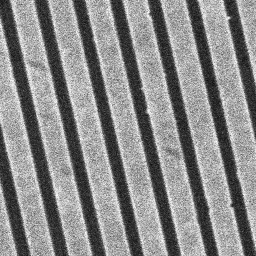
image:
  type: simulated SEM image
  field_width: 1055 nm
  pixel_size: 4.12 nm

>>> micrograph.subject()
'parallel lines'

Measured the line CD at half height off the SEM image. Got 25.9 px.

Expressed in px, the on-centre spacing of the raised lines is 36.8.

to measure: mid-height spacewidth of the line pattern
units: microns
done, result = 0.0442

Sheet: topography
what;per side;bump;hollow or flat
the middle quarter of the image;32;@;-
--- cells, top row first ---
@@@@@@---@@@@@@---@@@@@@@---@@@@
@@@@@@---@@@@@@@--@@@@@@@---@@@@
@@@@@@---@@@@@@@---@@@@@@---@@@@
@@@@@@@--@@@@@@@---@@@@@@---@@@@
@@@@@@@---@@@@@@---@@@@@@@---@@@
-@@@@@@---@@@@@@@--@@@@@@@---@@@
-@@@@@@---@@@@@@@--@@@@@@@---@@@
-@@@@@@@--@@@@@@@---@@@@@@---@@@
-@@@@@@@---@@@@@@---@@@@@@@--@@@
-@@@@@@@---@@@@@@---@@@@@@@---@@
--@@@@@@---@@@@@@@--@@@@@@@---@@
--@@@@@@---@@@@@@@--@@@@@@@---@@
--@@@@@@@---@@@@@@---@@@@@@@--@@
--@@@@@@@---@@@@@@---@@@@@@@---@
---@@@@@@---@@@@@@@--@@@@@@@---@
---@@@@@@---@@@@@@@---@@@@@@---@
---@@@@@@@--@@@@@@@---@@@@@@---@
---@@@@@@@---@@@@@@---@@@@@@@--@
@--@@@@@@@---@@@@@@---@@@@@@@---
@---@@@@@@---@@@@@@@---@@@@@@---
@---@@@@@@@--@@@@@@@---@@@@@@---
@---@@@@@@@---@@@@@@---@@@@@@@--
@@--@@@@@@@---@@@@@@---@@@@@@@--
@@---@@@@@@---@@@@@@@--@@@@@@@--
@@---@@@@@@---@@@@@@@---@@@@@@--
@@---@@@@@@@---@@@@@@---@@@@@@@-
@@---@@@@@@@---@@@@@@---@@@@@@@-
@@@---@@@@@@---@@@@@@@--@@@@@@@-
@@@---@@@@@@---@@@@@@@---@@@@@@-
@@@---@@@@@@@--@@@@@@@---@@@@@@-
@@@---@@@@@@@---@@@@@@---@@@@@@@
@@@@--@@@@@@@---@@@@@@---@@@@@@@